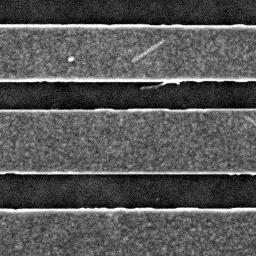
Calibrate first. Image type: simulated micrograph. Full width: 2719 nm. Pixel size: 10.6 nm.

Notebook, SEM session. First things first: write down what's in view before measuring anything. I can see lines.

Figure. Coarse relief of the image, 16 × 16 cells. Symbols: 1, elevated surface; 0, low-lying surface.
0000000000000000
0000000000000000
1111111111111111
1111111111111111
1111111111111111
0000000000000000
0000000000000000
1111111111111111
1111111111111111
1111111111111111
1111111111111111
0000000000000000
0000000000000000
1111111111111111
1111111111111111
1111111111111111